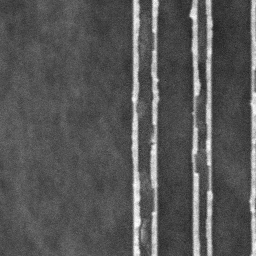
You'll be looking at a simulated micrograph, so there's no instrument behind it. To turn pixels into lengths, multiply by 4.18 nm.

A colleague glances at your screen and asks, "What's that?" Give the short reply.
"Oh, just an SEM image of one or a few lines or trenches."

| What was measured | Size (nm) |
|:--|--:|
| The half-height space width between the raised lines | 160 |